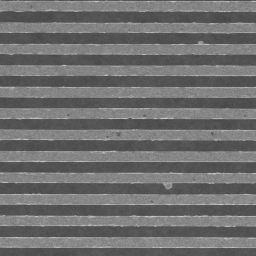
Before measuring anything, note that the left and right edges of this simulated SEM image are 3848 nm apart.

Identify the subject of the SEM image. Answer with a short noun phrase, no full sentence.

parallel lines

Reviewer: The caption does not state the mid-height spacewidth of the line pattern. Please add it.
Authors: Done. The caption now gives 173 nm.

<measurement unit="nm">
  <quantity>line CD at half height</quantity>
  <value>152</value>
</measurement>